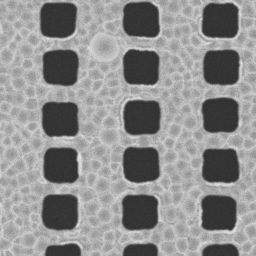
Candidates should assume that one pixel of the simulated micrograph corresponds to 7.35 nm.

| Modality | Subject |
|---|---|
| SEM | a regular array of holes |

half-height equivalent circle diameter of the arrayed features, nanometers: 283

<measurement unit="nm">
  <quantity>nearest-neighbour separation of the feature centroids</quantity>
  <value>347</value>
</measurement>